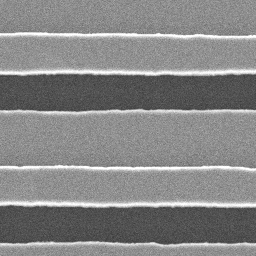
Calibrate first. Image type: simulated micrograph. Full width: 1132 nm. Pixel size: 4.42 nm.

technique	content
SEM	lines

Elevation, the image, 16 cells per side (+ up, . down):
++++++++++++++++
++++++++++++++++
++++++++++++++++
++++++++++++++++
++++++++++++++++
................
................
++++++++++++++++
++++++++++++++++
++++++++++++++++
++++++++++++++++
++++++++++++++++
++++++++++++++++
................
................
++++++++++++++++